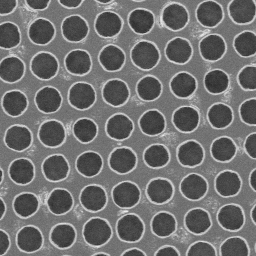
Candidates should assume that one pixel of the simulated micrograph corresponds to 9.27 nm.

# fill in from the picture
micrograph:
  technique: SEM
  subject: a regular array of holes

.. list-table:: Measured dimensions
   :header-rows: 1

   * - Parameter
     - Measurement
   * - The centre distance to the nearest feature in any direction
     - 311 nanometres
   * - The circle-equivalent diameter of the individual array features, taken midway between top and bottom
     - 239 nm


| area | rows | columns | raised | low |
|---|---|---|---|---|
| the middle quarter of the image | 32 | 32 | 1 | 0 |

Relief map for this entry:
00000001110000011100000111111111
10000011111000111111111111111111
11000111111111111111111111110001
11111111111111111111000111100000
11111111111000011110000011100000
11000001110000001100000011100000
10000000110000001100000011100000
10000000110000001110000011110000
10000000110000001110000111111111
10000000111000011111111111111111
11000001111101111111111111111111
11111111111111111111110111110000
11111111111110111111000011100000
11111111111100001110000001100000
11100000111000000110000001100000
11000000111000000110000001110000
11000000111000000110000001111000
11000000111000000111100011111111
11100000111100011111111111111111
11110011111111111111111111111110
11111111111111111111110001111000
11111111111110000111000000110000
11110000111100000011000000110000
11100000011000000011000000110000
01100000001000000011000000111000
01100000011100000011100001111100
01100000011100000111111111111111
01110000111111111111111111111111
11111111111111111111111111111100
11111111111111111111110000111000
11111100011110000011100000011000
11111000001100000001100000011000